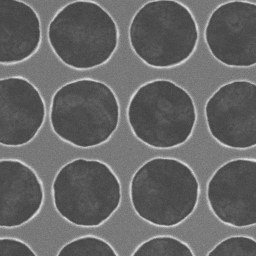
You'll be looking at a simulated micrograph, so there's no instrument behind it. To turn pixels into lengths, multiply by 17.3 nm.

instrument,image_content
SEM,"holes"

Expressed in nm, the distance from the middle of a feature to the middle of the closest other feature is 1330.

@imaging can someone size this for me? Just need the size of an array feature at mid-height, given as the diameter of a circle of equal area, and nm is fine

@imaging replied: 1160